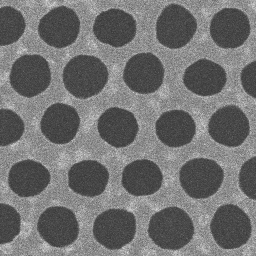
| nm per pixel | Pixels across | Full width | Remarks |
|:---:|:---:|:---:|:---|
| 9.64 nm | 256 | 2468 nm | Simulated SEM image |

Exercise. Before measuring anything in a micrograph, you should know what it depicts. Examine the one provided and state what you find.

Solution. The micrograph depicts a regular array of holes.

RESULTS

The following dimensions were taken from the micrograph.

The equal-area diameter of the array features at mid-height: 41.1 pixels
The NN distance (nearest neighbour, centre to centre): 525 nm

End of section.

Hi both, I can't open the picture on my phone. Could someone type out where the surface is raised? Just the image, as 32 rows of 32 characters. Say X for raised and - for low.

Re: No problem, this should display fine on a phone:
XXXXXXXXXXXXXXXXXXXXXXXXXXXXXXXX
--XXXX---XXXX---XXXX----XXX---XX
---XX-----XX-----XXX-----X-----X
---XX-----XX-----XX------X-----X
---XX-----XX-----XXX----XX-----X
-XXXXX---XXXX---XXXX---XXXX---XX
XXXXXXXXXXXXXXXXXXXXXXXXXXXXXXXX
XX----XXX----XXX----XXXXX-XXXXXX
X-----XX-----XXX----XXX-----XX--
X-----XX-----XX-----XXX-----XX--
X-----XX-----XXX----XXX-----XX--
XX---XXXX---XXXXX--XXXXX---XXXX-
XXXXXXXXXXXXXXXXXXXXXXXXXXXXXXXX
XXXXXX---XXXXX-XXXXXXXXXXXXX--XX
--XXX-----XXX----XXX----XX-----X
---XX-----XX-----XX-----XX-----X
---XX-----XX-----XXX----XX-----X
--XXXX---XXXX----XXX----XXX----X
XXXXXXXXXXXXXXXXXXXXXXXXXXXXXXXX
XXXXXXXXXXXXXXXXXXXXXXXXXXXXXXXX
XX---XXXX----XXX---XXXX----XXX--
X-----XXX----XX-----XX------XX--
X-----XXX-----X-----XX------XX--
X-----XXX----XX-----XXX----XXX--
XX--XXXXXXX-XXXXX-XXXXXX--XXXXX-
XXXXXXXXXXXXXXXXXXXXXXXXXXXXXXXX
--XXX----XXXX---XXXX---XXXX----X
---XX-----XX-----XX-----XXX----X
---XX-----XX-----X------XX-----X
--XXX-----XX-----XX-----XXX----X
XXXXXX---XXXX---XXX----XXXX----X
XXXXXXXXXXXXXXXXXXXXXXXXXXXXXXXX